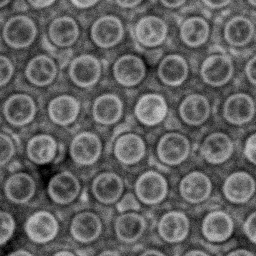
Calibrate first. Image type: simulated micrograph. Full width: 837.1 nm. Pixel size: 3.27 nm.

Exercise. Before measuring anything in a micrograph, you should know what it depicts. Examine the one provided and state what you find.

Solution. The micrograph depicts a regular array of raised bodies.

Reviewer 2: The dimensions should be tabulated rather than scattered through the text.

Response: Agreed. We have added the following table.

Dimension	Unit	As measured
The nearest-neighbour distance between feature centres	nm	143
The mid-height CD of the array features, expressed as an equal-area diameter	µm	0.0926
